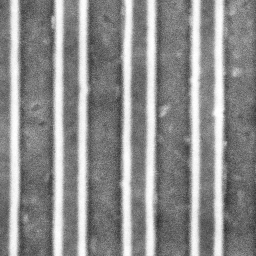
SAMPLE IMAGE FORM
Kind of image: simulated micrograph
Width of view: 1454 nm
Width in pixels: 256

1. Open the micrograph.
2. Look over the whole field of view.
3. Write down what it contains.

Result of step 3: one or a few lines or trenches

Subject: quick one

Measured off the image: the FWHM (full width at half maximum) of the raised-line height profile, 138 nm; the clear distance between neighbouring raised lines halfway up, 248 nm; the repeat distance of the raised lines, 0.387 microns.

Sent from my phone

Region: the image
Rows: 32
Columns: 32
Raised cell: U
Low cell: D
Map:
UUDDDDDUUUDDDDDDUUUDDDDDDUUDDDDD
UUDDDDDUUUDDDDDDUUUDDDDDUUUDDDDD
UUDDDDDUUUDDDDDDUUUDDDDDUUUDDDDD
UUDDDDDUUUDDDDDDUUUDDDDDUUUDDDDD
UUDDDDDUUUDDDDDDUUUDDDDDUUUDDDDD
UUDDDDDUUUDDDDDDUUUDDDDDUUUDDDDD
UUDDDDDUUUDDDDDDUUUDDDDDUUUDDDDD
UUDDDDDUUUDDDDDDUUUDDDDDUUUDDDDD
UUDDDDDUUUDDDDDDUUUDDDDDUUUDDDDD
UUDDDDDUUUDDDDDDUUUDDDDDUUUDDDDD
UUDDDDDUUUDDDDDDUUUDDDDDUUUDDDDD
UUDDDDDUUUUDDDDDUUUDDDDDUUUDDDDD
UUDDDDDUUUDDDDDDUUUDDDDDUUUDDDDD
UUDDDDDUUUDDDDDDUUUDDDDDUUUDDDDD
UUDDDDDUUUDDDDDDUUUDDDDDUUUDDDDD
UUDDDDDUUUDDDDDDUUUDDDDDUUUDDDDD
UUDDDDDUUUDDDDDDUUUDDDDDDUUDDDDD
UUDDDDDUUUDDDDDDUUUDDDDDDUUDDDDD
UUDDDDDUUUDDDDDDUUUDDDDDDUUDDDDD
UUDDDDDUUUDDDDDDUUUDDDDDDUUDDDDD
UUDDDDDUUUDDDDDDUUUDDDDDDUUDDDDD
UUDDDDDUUUDDDDDDUUUDDDDDDUUDDDDD
UUDDDDDUUUDDDDDDUUUDDDDDDUUDDDDD
UUDDDDDUUUDDDDDDUUUDDDDDUUUDDDDD
UUDDDDDUUUDDDDDDUUUDDDDDUUUDDDDD
UUDDDDDUUUDDDDDDUUUDDDDDUUUDDDDD
UUDDDDDUUUDDDDDDUUUDDDDDUUUDDDDD
UUDDDDDUUUDDDDDDUUUDDDDDUUUDDDDD
UUDDDDDUUUDDDDDDUUUDDDDDUUUDDDDD
UUDDDDDUUUDDDDDDUUUDDDDDUUUDDDDD
UUDDDDDUUUDDDDDDUUUDDDDDUUUDDDDD
UUDDDDDUUUDDDDDDUUUDDDDDUUUDDDDD